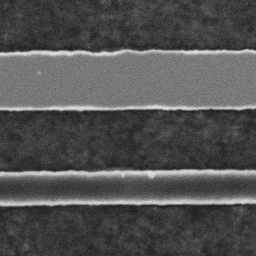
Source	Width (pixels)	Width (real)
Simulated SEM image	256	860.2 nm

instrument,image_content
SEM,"lines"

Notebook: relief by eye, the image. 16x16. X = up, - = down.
----------------
----------------
----------------
XXXXXXXXXXXXXXXX
XXXXXXXXXXXXXXXX
XXXXXXXXXXXXXXXX
XXXXXXXXXXXXXXXX
----------------
----------------
----------------
----------------
XXXXXXXXXXXXXXXX
XXXXXXXXXXXXXXXX
----------------
----------------
----------------